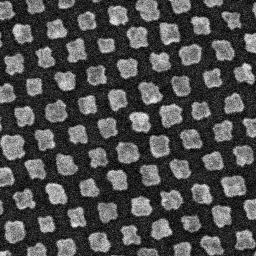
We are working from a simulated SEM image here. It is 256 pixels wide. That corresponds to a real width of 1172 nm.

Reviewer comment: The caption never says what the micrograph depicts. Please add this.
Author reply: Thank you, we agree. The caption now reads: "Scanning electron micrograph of a regular array of raised bodies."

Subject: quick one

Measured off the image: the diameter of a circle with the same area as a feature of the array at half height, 87.7 nm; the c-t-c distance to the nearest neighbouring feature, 139 nanometres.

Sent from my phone